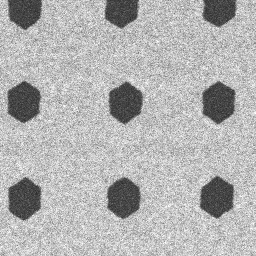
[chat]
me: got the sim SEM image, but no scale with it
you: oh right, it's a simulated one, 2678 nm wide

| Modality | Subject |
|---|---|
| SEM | holes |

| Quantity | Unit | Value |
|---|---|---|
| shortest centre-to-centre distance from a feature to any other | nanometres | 974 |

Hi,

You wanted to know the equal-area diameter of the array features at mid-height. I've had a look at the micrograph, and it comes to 383 nanometres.